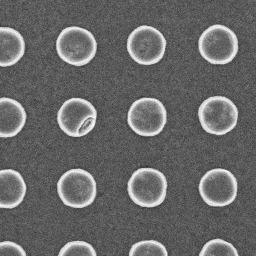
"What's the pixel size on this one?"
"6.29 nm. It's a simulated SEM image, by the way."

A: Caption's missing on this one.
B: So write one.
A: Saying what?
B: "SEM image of a regular array of raised bodies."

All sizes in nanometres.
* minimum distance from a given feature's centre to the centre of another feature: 443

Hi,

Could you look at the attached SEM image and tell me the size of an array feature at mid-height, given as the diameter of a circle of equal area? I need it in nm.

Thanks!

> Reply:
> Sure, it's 235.